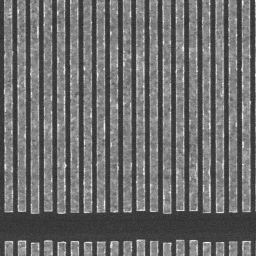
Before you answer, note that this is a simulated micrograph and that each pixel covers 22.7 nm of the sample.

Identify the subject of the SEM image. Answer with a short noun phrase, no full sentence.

parallel lines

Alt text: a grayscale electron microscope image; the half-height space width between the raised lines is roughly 128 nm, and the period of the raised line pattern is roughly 300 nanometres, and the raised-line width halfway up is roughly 0.173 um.